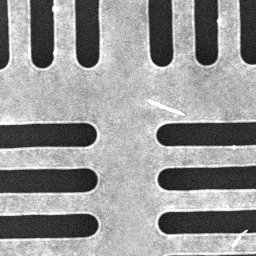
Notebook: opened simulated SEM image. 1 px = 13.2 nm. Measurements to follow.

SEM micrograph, groups of lines, slits or small figures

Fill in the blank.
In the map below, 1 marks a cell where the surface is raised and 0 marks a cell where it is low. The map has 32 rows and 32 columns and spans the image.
01110001100011111100001100011100
01110001100011111100001100011100
01110001100011111100001100011100
01110001100011111100001100011100
01110001100001111110001100011100
01110001100001111110001100011100
01110001100001111110001100011100
01110001110011111110001110011100
01111011111111111111111111111111
11111111111111111111111111111111
11111111111111111111111111111111
11111111111111111111111111111111
11111111111111111111111111111111
11111111111111111111111111111111
11111111111111111111111111111111
00000000000111111111100000000000
00000000000011111111000000000000
00000000000011111111000000000000
00000000001111111111111111111111
11111111111111111111111111111111
11111111111111111111111111111111
00000000000011111111000000000000
00000000000011111111000000000000
00000000000011111111000000000000
11111111111111111111111111111111
11111111111111111111111111111111
11111111111111111111100000000000
00000000000011111111000000000000
00000000000011111111000000000000
00000000000111111111111111111111
11111111111111111111111111111111
11111111111111111111111111111111